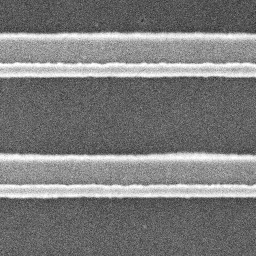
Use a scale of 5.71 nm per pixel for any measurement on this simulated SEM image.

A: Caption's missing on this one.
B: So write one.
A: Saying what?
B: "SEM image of lines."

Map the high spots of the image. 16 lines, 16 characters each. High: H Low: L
LLLLLLLLLLLLLLLL
LLLLLLLLLLLLLLLL
HHHHHHHHHHHHHHHH
HHHHHHHHHHHHHHHH
HHHHHHHHHHHHHHHH
LLLLLLLLLLLLLLLL
LLLLLLLLLLLLLLLL
LLLLLLLLLLLLLLLL
LLLLLLLLLLLLLLLL
LLLLLLLLLLLLLLLL
HHHHHHHHHHHHHHHH
HHHHHHHHHHHHHHHH
LLLLLLLLLLLLLLLL
LLLLLLLLLLLLLLLL
LLLLLLLLLLLLLLLL
LLLLLLLLLLLLLLLL